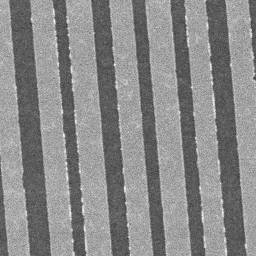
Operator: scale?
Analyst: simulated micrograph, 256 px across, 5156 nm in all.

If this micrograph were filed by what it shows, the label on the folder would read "parallel lines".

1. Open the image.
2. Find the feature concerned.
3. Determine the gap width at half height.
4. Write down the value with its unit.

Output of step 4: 345 nanometers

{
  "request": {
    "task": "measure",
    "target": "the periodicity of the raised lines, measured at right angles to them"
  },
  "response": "783 nm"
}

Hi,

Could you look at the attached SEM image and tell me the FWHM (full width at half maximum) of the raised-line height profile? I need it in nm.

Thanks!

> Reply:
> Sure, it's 437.